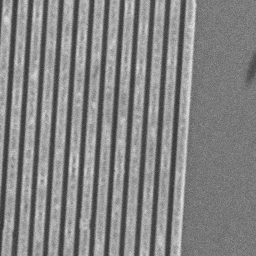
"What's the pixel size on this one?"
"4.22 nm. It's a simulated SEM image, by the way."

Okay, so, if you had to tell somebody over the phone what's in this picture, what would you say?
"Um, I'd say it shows parallel lines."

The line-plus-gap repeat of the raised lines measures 64.4 nm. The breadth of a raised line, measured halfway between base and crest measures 9.36 pixels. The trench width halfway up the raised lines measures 5.88 pixels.